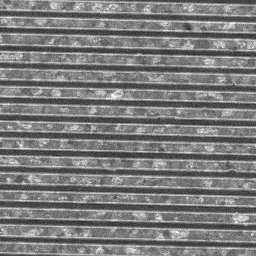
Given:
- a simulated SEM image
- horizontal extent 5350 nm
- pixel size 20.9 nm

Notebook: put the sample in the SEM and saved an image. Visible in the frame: parallel lines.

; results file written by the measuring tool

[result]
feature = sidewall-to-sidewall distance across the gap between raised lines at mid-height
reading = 136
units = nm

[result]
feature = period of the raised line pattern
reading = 363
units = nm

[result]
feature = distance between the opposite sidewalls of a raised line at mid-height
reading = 232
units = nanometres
